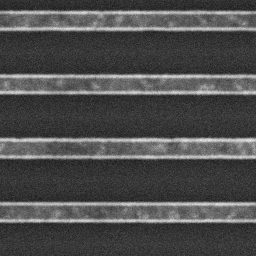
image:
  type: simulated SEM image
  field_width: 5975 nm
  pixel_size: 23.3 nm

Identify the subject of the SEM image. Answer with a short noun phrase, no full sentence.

one or a few lines or trenches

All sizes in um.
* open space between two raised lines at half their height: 1.07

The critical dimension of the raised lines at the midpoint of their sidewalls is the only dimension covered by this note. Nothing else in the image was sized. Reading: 0.423 um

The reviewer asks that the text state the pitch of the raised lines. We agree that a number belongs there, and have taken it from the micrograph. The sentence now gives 1490 nanometres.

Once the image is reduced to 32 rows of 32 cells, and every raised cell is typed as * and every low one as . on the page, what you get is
................................
................................
********************************
********************************
................................
................................
................................
................................
................................
*************...................
********************************
********************************
................................
................................
................................
................................
................................
*....*...................**.....
********************************
********************************
................................
................................
................................
................................
................................
********************************
********************************
********************************
................................
................................
................................
................................